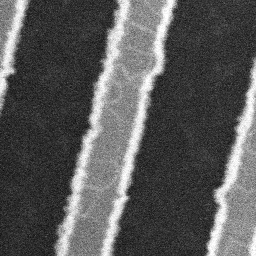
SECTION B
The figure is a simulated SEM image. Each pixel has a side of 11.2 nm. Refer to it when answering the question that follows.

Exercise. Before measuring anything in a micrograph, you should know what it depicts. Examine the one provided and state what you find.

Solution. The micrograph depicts one or a few lines or trenches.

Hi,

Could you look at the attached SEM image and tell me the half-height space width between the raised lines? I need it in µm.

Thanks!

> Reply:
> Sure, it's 1.14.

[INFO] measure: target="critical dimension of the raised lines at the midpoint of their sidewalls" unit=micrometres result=0.478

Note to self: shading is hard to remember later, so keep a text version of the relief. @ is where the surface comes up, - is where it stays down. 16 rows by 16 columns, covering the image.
@-------@@@-----
@-------@@------
@------@@@------
-------@@@------
-------@@@------
------@@@-------
------@@@-------
------@@@------@
------@@-------@
-----@@@-------@
-----@@@-------@
-----@@@------@@
-----@@@------@@
----@@@-------@@
----@@@-------@@
----@@@------@@@